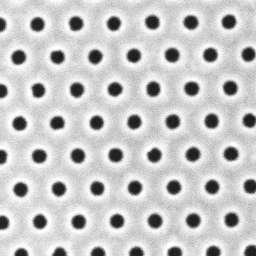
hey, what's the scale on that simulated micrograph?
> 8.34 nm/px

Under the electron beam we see a regular array of holes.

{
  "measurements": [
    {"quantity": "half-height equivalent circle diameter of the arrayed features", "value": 16.1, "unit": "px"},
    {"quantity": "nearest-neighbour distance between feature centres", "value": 37.9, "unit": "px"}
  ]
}